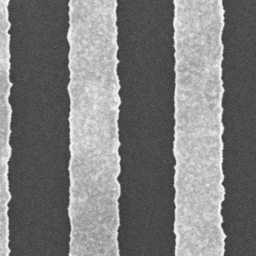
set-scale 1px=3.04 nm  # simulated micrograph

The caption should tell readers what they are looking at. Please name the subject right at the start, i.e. lines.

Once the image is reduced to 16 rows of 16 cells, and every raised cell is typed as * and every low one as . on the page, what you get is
....***....***..
*...***....***..
*...***....***..
*...***....***..
*...***....***..
*...***....***..
*...***....***..
*...***....***..
*...***....***..
*...***....***..
....***....***..
....***....***..
*...***....***..
....***....***..
....***....***..
*...***....***..